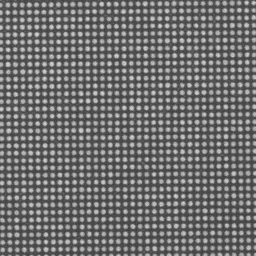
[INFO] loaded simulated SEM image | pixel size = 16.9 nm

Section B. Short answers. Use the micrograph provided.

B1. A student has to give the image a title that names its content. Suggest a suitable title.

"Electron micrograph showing a regular array of raised bodies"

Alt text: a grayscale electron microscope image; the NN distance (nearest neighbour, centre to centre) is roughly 0.118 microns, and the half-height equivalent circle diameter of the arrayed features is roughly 71.4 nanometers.